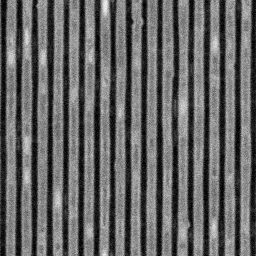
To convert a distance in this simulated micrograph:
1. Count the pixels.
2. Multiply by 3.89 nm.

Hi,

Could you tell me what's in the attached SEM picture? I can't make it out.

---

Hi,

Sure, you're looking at parallel lines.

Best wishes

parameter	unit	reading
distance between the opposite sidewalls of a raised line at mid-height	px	8.87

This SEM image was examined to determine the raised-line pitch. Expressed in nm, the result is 60.8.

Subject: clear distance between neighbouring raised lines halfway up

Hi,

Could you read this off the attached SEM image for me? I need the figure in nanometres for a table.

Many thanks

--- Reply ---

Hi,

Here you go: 26.7